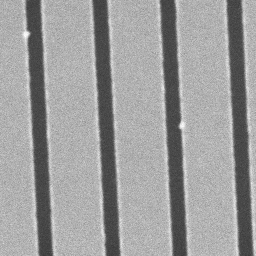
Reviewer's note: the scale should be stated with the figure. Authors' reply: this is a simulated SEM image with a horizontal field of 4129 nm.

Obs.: lines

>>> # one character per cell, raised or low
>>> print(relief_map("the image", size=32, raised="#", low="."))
###..#######..######..######..##
###..#######..######..######..##
###..#######..######..######..##
###..#######..######..######..##
####.#######..######..######...#
###..#######..######..######...#
###...######..######..#######..#
###...######..######..#######..#
####..######..######..#######..#
####..######..######..#######..#
####..######..######...######..#
####..######..#######..######..#
####..######..#######..######..#
####..######..#######..######..#
####..######..#######..######..#
####..######..#######..######..#
####..######..#######..######..#
####..######..#######..######..#
####..######..#######..######..#
####..#######.#######..######..#
####..#######..######..######..#
####..#######..######..######..#
####..#######..######..######..#
####..#######..######..######..#
####..#######..######..######..#
####..#######..######..######...
####..#######..######..#######..
#####.#######..######..#######..
#####..######..######..#######..
#####..######..######..#######..
#####..######..#######.#######..
#####..######..#######..######..